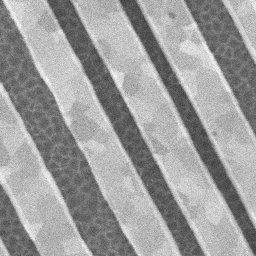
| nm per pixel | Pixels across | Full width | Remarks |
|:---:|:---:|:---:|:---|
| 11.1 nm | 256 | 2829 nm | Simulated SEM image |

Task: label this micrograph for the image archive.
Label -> one or a few lines or trenches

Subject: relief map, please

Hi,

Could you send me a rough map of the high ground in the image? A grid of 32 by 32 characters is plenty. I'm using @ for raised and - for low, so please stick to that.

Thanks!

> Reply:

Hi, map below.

-@@@@@---@@@@@@---@@@@@-----@@@@
-@@@@@----@@@@@---@@@@@@-----@@@
--@@@@@---@@@@@@---@@@@@------@@
---@@@@----@@@@@---@@@@@@-----@@
---@@@@@---@@@@@@---@@@@@------@
----@@@@----@@@@@---@@@@@@-----@
----@@@@@---@@@@@@---@@@@@------
----@@@@@@---@@@@@---@@@@@@-----
-----@@@@@----@@@@@---@@@@@-----
-----@@@@@@---@@@@@@--@@@@@@----
------@@@@@----@@@@@---@@@@@----
-------@@@@@---@@@@@@--@@@@@@---
@------@@@@@----@@@@@---@@@@@---
@@------@@@@----@@@@@@---@@@@@--
@@------@@@@@----@@@@@---@@@@@--
@@@------@@@@@---@@@@@@---@@@@@-
@@@------@@@@@----@@@@@---@@@@@-
@@@@------@@@@@---@@@@@@---@@@@@
@@@@------@@@@@----@@@@@---@@@@@
@@@@@------@@@@@---@@@@@@---@@@@
@@@@@------@@@@@----@@@@@---@@@@
@@@@@@------@@@@@----@@@@@---@@@
@@@@@@------@@@@@----@@@@@---@@@
-@@@@@@------@@@@@----@@@@@---@@
--@@@@@@-----@@@@@----@@@@@---@@
--@@@@@@------@@@@@----@@@@@---@
--@@@@@@------@@@@@@---@@@@@@--@
---@@@@@@------@@@@@----@@@@@---
---@@@@@@------@@@@@@---@@@@@@--
----@@@@@@------@@@@@----@@@@@--
----@@@@@@@------@@@@@---@@@@@@-
@----@@@@@@------@@@@@----@@@@@-